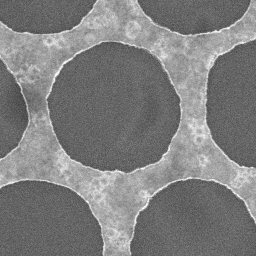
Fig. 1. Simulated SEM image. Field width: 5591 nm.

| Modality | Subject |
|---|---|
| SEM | holes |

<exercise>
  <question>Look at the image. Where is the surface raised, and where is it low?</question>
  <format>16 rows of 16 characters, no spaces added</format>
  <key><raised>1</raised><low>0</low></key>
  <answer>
0000001110000000
0000011111000001
1111111111111111
1111100000111100
0111000000111000
0110000000011000
0010000000011000
0010000000011000
0111000000011000
0111000000111100
1111110001111111
1000111111100011
0000011110000001
0000001110000000
0000001100000000
0000001100000000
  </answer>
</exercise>